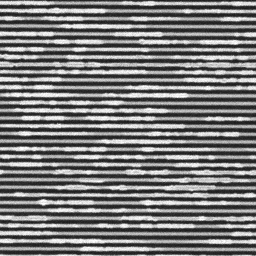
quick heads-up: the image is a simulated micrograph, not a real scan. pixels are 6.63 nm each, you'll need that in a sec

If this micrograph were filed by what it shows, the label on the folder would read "parallel lines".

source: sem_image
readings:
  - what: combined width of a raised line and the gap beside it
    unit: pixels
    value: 7.68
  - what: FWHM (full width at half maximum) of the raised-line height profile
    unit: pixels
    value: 3.5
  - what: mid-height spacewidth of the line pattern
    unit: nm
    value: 28.2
